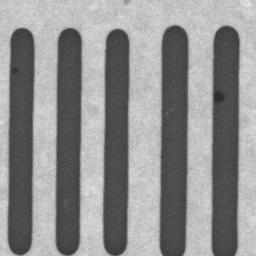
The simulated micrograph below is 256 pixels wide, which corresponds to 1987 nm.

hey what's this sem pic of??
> groups of lines, slits or small figures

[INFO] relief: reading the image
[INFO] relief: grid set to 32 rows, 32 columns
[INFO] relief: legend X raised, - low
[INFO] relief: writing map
XXXXXXXXXXXXXXXXXXXXXXXXXXXXXXXX
XXXXXXXXXXXXXXXXXXXXXXXXXXXXXXXX
XXXXXXXXXXXXXXXXXXXXXXXXXXXXXXXX
XXXXXXXXXXXXXXXXXXXXX--XXXX--XXX
X---XXX---XXX---XXXX---XXXX---XX
X---XXX---XXX---XXXX----XXX---XX
X---XXX---XXX---XXXX----XXX---XX
X---XXX---XXX---XXXX----XXX---XX
X---XXX---XXX---XXXX----XXX---XX
X---XXX---XXX---XXXX----XXX---XX
X---XXX---XXX---XXXX----XXX---XX
X---XXX---XXX---XXXX----XXX---XX
X---XXX---XXX---XXXX----XXX---XX
X---XXX---XXX---XXXX----XXX---XX
X---XXX---XXX---XXXX----XXX---XX
X---XXX---XXX---XXXX----XXX---XX
X---XXX---XXX---XXXX----XXX---XX
X---XXX---XXX---XXXX----XXX---XX
X---XXX---XXX---XXXX----XXX---XX
X---XXX---XXX---XXXX----XX----XX
X---XXX---XXX---XXXX----XX----XX
X---XXX---XXX---XXXX---XXX----XX
X---XXX---XXX---XXXX---XXX----XX
X---XXX---XXX---XXXX---XXX----XX
X---XXX---XXX---XXXX---XXXX---XX
X---XXX---XXX---XXXX---XXXX---XX
X---XXX---XXX---XXXX---XXX----XX
X---XXX---XXX---XXXX---XXX----XX
X---XXX---XXX---XXXX---XXX----XX
X---XXX---XXX---XXXX---XXX----XX
X---XXX---XXX---XXXX---XXX----XX
X--XXXX---XXX---XXXX---XXXX---XX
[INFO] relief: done